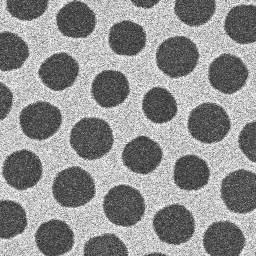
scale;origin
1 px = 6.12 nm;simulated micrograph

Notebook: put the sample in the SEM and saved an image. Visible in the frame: a regular array of holes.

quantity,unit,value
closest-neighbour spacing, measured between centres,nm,321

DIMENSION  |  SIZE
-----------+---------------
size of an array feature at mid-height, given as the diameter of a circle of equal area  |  40.3 pixels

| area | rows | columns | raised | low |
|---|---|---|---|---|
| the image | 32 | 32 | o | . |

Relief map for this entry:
o.....oo...oooooo...oo.....ooooo
o.....o.....oooooooooo.....oo...
ooo.ooo.....oooooooooo....oo....
ooooooo.....oo....oooooooooo....
..oooooo...ooo....oooo.oooooo...
...ooooooooooo....oo....oooooo.o
....oooooooooo...ooo.....ooooooo
...ooo...oooooooooo......oo...oo
..ooo.....oooooooooo....oo.....o
ooooo.....oo....ooooo..ooo.....o
.ooooo...oo.....oooooooooo.....o
.oooooooooo.....oo...ooooooo.ooo
..oooooooooo....oo....oooooooooo
.oo....ooooooooooo....oo....oooo
.o......oooooooooo....oo.....ooo
oo......o....oooooooooo......oo.
ooo....oo.....oooooooooo.....o..
ooooooooo.....oo...oooooo...oo..
ooooooooo.....o.....oooooooooo..
o....ooooo...oo.....ooo.ooooooo.
.....ooooooooooo....oo....oooooo
.....ooo...oooooo..ooo....ooo..o
o....oo.....oooooooooo....oo....
oo..ooo.....oo...ooooo...ooo....
ooooooo.....o.....oooooooooo....
..ooooo....oo.....oooooooooo....
...oooooooooo.....oo....ooooo..o
...ooo.ooooooo...oo.....oooooooo
...oo....oooooooooo.....oo....oo
..oo.....ooo...ooooo....o......o
oooo.....oo.....ooooo..oo......o
ooooo...oo......oooooooooo....oo